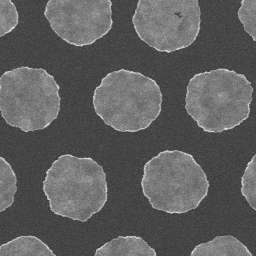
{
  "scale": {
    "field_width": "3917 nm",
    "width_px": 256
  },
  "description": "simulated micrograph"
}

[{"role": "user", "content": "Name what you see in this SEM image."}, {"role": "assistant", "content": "raised bodies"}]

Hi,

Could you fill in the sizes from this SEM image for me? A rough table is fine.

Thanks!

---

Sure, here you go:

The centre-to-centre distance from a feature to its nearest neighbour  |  1420 nm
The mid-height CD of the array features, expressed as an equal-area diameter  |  0.984 micrometres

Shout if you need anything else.